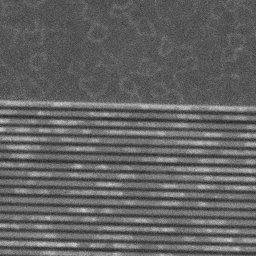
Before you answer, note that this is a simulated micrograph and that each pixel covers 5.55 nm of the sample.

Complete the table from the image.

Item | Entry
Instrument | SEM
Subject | parallel lines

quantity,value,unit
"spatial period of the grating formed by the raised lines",48.4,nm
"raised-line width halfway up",24.3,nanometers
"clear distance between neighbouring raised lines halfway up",25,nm